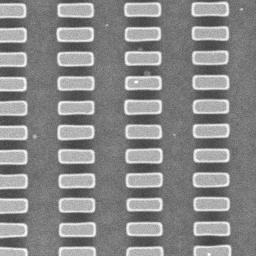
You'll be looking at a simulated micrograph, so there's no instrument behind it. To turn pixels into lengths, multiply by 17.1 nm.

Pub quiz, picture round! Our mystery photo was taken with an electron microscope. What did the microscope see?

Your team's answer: groups of lines, slits or small figures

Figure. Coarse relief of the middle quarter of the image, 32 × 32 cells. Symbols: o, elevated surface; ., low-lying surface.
................................
................................
................................
ooooooo.........oooooooo........
ooooooo.........oooooooo........
ooooooo.........oooooooo........
................................
................................
................................
ooooooo.........oooooooo........
ooooooo........ooooooooo........
ooooooo........ooooooooo........
oooo.oo.........oooo............
................................
................................
o...............ooooooo.........
ooooooo.........oooooooo........
ooooooo.........oooooooo........
ooooooo.........oooooooo........
................................
................................
................oooooooo........
ooooooo.........oooooooo........
ooooooo.........oooooooo........
ooooooo.........oooooooo........
................................
................................
.................ooooooo........
oooooooo........oooooooo........
oooooooo........oooooooo........
ooooooo.........oooooooo........
................................